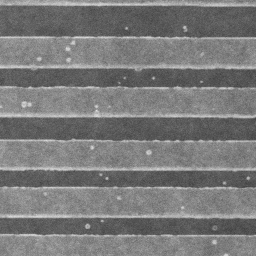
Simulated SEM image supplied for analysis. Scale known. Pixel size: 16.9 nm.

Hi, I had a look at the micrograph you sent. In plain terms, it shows lines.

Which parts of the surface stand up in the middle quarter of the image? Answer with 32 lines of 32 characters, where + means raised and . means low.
++........++...++++++++++++++++.
................................
................................
................................
................................
................................
++++++++++++++++++++++++++++++++
++++++++++++++++++++++++++++++++
++++++++++++++++++++++++++++++++
++++++++++++++++++++++++++++++++
++++++++++++++++++++++++++++++++
++++++++++++++++++++++++++++++++
++++++++++++++++++++++++++++++++
................................
................................
................................
................................
................................
................................
++++++++++++++++++++++++++++++++
++++++++++++++++++++++++++++++++
++++++++++++++++++++++++++++++++
++++++++++++++++++++++++++++++++
++++++++++++++++++++++++++++++++
++++++++++++++++++++++++++++++++
++++++++++++++++++++++++++++++++
................................
................................
................................
................................
................................
++++++++++++++++++++++++++++++++